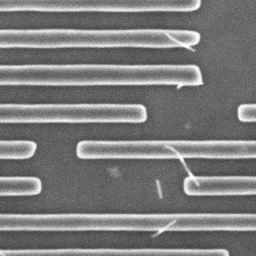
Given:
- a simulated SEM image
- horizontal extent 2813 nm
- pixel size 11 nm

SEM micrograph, wiring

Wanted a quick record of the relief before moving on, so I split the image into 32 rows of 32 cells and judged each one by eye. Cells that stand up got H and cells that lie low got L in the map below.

HHHHHHHHHHHHHHHHHHHHHHHHHLLLLLLL
LLLLLLLLLLLLLLLLLLLLLLLLLLLLLLLL
LLLLLLLLLLLLLLLLLLLLLLLLLLLLLLLL
LLLLLLLLLLLLLLLLLLLLLLLLLLLLLLLL
HHHHHHHHHHHHHHHHHHHHHHHHHLLLLLLL
HHHHHHHHHHHHHHHHHHHHHHHHLLLLLLLL
LLLLLLLLLLLLLLLLLLLLLLLLLLLLLLLL
LLLLLLLLLLLLLLLLLLLLLLLLLLLLLLLL
HHHHHHHHHHHHHHHHHHHHHHHHHLLLLLLL
HHHHHHHHHHHHHHHHHHHHHHHHHLLLLLLL
HHHHHHHHHHHHLLLLLLLLLLHHHLLLLLLL
LLLLLLLLLLLLLLLLLLLLLLLLLLLLLLLL
LLLLLLLLLLLLLLLLLLLLLLLLLLLLLLLL
HHHHHHHHHHHHHHHHHHLLLLLLLLLLLLHH
HHHHHHHHHHHHHHHHHHLLLLLLLLLLLLHH
LLLLLLLLLLLLLLLLLLLLLLLLLLLLLLLL
LLLLLLLLLLLLLLLLLLLLLLLLLLLLLLLL
LLLLLLLLLLLLLLLLLLLLLLLLLLLLLLLL
HHHHLLLLLLHHHHHHHHHHHHHHHHHHHHHH
HHHHLLLLLLHHHHHHHHHHHHHHHHHHHHHH
LLLLLLLLLLLLLLLLLLLLLLLLLLLLLLLL
LLLLLLLLLLLLLLLLLLLLLLLLLLLLLLLL
HHHHHLLLLLLLLLLLLLLLLLLHHHHHHHHH
HHHHHLLLLLLLLLLLLLLLLLLHHHHHHHHH
LLLLLLLLLLLLLLLLLLLLLLLLLLLLLLLL
LLLLLLLLLLLLLLLLLLLLLLLLLLLLLLLL
LLLLLLLLLLLLLLLLLLLLLLLLLLLLLLLL
HHHHHHHHHHHHHHHHHHHHHHHHHHHHHHHH
HHHHHHHHHHHHHHHHHHHHHHHHHHHHHHHH
LLLLLLLLLLLLLLLLLLLLLLLLLLLLLLLL
LLLLLLLLLLLLLLLLLLLLLLLLLLLLLLLL
HHHHHHHHHHHHHHHHHHHHHHHHHHHHLLLL